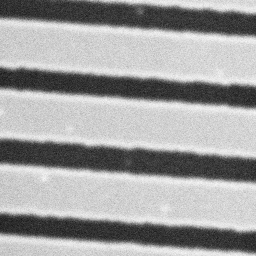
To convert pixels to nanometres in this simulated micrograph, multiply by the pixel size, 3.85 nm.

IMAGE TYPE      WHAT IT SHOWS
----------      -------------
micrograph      lines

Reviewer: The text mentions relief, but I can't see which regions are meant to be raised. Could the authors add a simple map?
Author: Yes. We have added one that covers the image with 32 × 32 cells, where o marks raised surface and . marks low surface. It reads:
...................ooooooooooooo
...............................o
o...............................
oooooooooooooo..................
oooooooooooooooooooooooooooo....
oooooooooooooooooooooooooooooooo
oooooooooooooooooooooooooooooooo
oooooooooooooooooooooooooooooooo
.o...ooooooooooooooooooooooooooo
................oooooooooooooooo
...............................o
oooo............................
oooooooooooooooo................
ooooooooooooooooooooooooooooo...
oooooooooooooooooooooooooooooooo
oooooooooooooooooooooooooooooooo
oooooooooooooooooooooooooooooooo
....oooooooooooooooooooooooooooo
..................oooooooooooooo
..............................oo
................................
oooooooooooo....................
ooooooooooooooooooooooooo.......
oooooooooooooooooooooooooooooooo
oooooooooooooooooooooooooooooooo
oooooooooooooooooooooooooooooooo
oooooooooooooooooooooooooooooooo
..............oooooooooooooooooo
...........................ooooo
oo..............................
ooooooooooooooo.................
oooooooooooooooooooooooooooo....